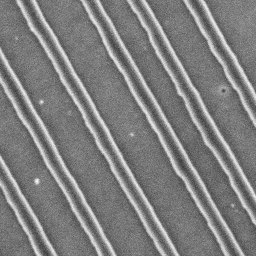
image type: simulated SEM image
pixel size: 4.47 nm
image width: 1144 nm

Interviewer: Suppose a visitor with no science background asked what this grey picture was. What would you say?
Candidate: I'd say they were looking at lines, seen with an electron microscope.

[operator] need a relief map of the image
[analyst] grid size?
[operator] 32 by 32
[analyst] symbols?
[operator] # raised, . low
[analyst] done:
..###.....###...##.....###......
...##......##....##.....##......
...###.....###...###....###.....
....##......##....##.....##.....
.....##......##....##.....##....
.....##......##....##.....##....
......##......##....##.....##...
#.....##......###...##.....###..
#......##......##....##.....##..
##.....###......##...##.....###.
###.....##......##....##.....##.
.##......##.....###...###.....##
.###.....##......##....##.....##
..##......##......##...###.....#
..###.....##......###...##.....#
...##......##......##...###.....
....##.....###......##...##.....
....##......##......##...###....
.....##.....###......##...###...
.....##......##......##....##...
#.....##......##......##....##..
#.....###.....##......###...##..
##.....##......##......##....##.
##......##.....##......###...##.
.##.....##......##......##....##
.##......##......##......##...##
..##.....##......##......##....#
..###.....##......##......##...#
...##.....###.....##......###...
....##.....##......##......##...
....##......##.....###.....###..
....###.....##......##......##..